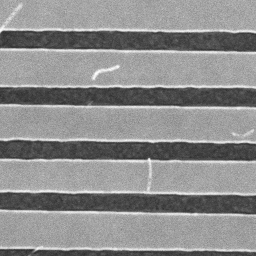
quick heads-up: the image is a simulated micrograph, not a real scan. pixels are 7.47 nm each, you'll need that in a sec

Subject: lines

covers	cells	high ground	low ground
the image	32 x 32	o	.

oooooooooooooooooooooooooooooooo
oooooooooooooooooooooooooooooooo
oooooooooooooooooooooooooooooooo
oooooooooooooooooooooooooooooooo
................................
................................
oooooooooooooooooooooooooooooo..
oooooooooooooooooooooooooooooooo
oooooooooooooooooooooooooooooooo
oooooooooooooooooooooooooooooooo
oooooooooooooooooooooooooooooooo
................................
................................
oooooooooooooooooooooooooooooooo
oooooooooooooooooooooooooooooooo
oooooooooooooooooooooooooooooooo
oooooooooooooooooooooooooooooooo
oo.ooooooooooooooooooooooooooooo
................................
................................
oooooooooooooooooooooooooooooooo
oooooooooooooooooooooooooooooooo
oooooooooooooooooooooooooooooooo
oooooooooooooooooooooooooooooooo
................................
................................
oooooooooooooo..................
oooooooooooooooooooooooooooooooo
oooooooooooooooooooooooooooooooo
oooooooooooooooooooooooooooooooo
oooooooooooooooooooooooooooooooo
................................